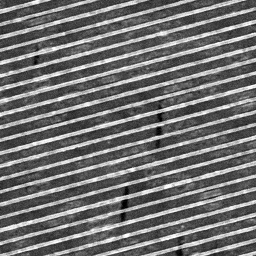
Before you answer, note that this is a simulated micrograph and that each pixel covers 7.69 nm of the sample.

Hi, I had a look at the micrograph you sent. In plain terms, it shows parallel lines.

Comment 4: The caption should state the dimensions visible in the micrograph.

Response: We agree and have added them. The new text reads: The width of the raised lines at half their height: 21.3 nanometres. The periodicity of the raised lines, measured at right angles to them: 95.6 nanometers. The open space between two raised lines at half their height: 72.5 nm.